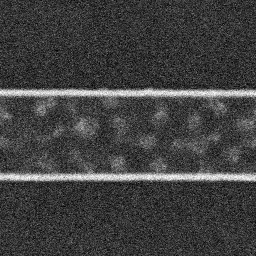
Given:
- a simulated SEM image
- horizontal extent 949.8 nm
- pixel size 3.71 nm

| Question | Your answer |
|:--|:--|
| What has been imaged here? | one or a few lines or trenches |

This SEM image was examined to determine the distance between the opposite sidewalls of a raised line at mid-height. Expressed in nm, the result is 315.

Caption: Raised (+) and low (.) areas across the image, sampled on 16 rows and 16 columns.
................
................
................
................
................
................
++++++++++++++++
++++++++++++++++
++++++++++++++++
++++++++++++++++
++++++++++++++++
................
................
................
................
................